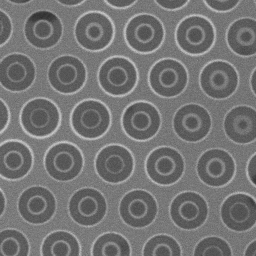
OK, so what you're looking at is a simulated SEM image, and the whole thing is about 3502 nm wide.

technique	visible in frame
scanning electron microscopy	an array of small figures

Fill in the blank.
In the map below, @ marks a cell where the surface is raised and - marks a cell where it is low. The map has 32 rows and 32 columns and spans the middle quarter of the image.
@@---@@@@---------@@@@--------@@
@@@---@@@---@@@---@@@@----@----@
@@@---@@---@@@@---@@@---@@@@---@
@@@---@@---@@@@@---@@---@@@@---@
@@---@@@@---@@@---@@@---@@@@---@
-----@@@@---------@@@---------@@
----@@@@@@-------@@@@@--------@@
@@@@@@@@@@@----@@@@@@@@------@@@
@@@@@@@@@@@@@@@@@@@@@@@@@@@@@@@@
@@@@-----@@@@@@@@@---@@@@@@@@@@@
@@@-------@@@@@@-------@@@@@@---
@@---------@@@@--------@@@@@----
@@---@@@@---@@@---@@----@@@@----
@@---@@@@---@@---@@@@---@@@---@@
@@---@@@@---@@---@@@@---@@@---@@
@@---@@@---@@@@---@@@---@@@---@@
@@---------@@@@---------@@@@----
@@@-------@@@@@@-------@@@@@----
@@@@@---@@@@@@@@@-----@@@@@@@---
@@@@@@@@@@@@@@@@@@@@@@@@@@@@@@@@
---@@@@@@@@---@@@@@@@@@@@@@@@@@@
----@@@@@-------@@@@@@------@@@@
@---@@@@---------@@@@--------@@@
@@---@@@---@@@---@@@@---@@----@@
@@---@@@--@@@@@---@@@--@@@@---@@
@@---@@@--@@@@@---@@---@@@@---@@
@---@@@@---@@@@--@@@---@@@@---@@
----@@@@@--------@@@@---------@@
---@@@@@@-------@@@@@--------@@@
@@@@@@@@@@@----@@@@@@@------@@@@
@@@@@@@@@@@@@@@@@@@@@@@@@@@@@@@@
@@@@----@@@@@@@@@@--@@@@@@@@@@@@